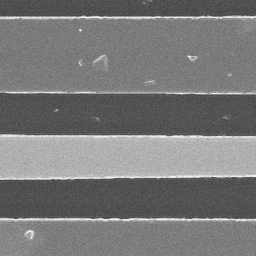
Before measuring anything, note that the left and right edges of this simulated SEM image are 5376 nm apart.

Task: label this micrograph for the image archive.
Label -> lines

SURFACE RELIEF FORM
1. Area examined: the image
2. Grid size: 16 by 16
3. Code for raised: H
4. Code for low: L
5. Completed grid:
LLLLLLLLLLLLLLLL
HHHHHHHHHHHHHHHH
HHHHHHHHHHHHHHHH
HHHHHHHHHHHHHHHH
HHHHHHHHHHHHHHHH
HHHHHHHHHHHHHHHH
LLLLLLLLLLLLLLLL
LLLLLLLLLLLLLLLL
HHHHHHHHHHLLLLLL
HHHHHHHHHHHHHHHH
HHHHHHHHHHHHHHHH
LLLLLLLLLLLLLLLL
LLLLLLLLLLLLLLLL
LLLLLLLLLLLLLLLL
HHHHHHHHHHHHHHHH
HHHHHHHHHHHHHHHH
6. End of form